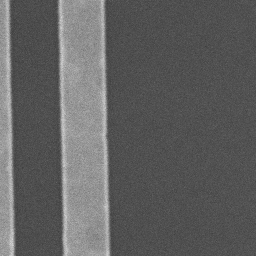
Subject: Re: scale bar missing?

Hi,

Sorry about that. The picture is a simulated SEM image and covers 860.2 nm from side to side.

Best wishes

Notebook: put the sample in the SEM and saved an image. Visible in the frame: one or a few lines or trenches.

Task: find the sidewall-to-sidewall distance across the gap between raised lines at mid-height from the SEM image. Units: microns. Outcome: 0.173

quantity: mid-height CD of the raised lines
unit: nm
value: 145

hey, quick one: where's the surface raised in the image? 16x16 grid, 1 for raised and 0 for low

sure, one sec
1000110000000000
1000110000000000
1000110000000000
1000110000000000
1000111000000000
1000111000000000
1000111000000000
1000111000000000
1000111000000000
1000111000000000
1000111000000000
1000111000000000
1000111000000000
1000111000000000
1000111000000000
1000111000000000